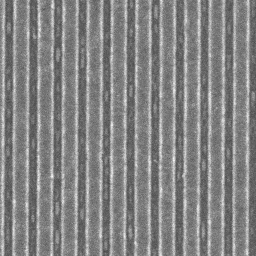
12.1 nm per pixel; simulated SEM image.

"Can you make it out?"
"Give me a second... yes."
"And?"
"parallel lines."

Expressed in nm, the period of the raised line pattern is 295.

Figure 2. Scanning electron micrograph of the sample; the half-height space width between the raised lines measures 116 nm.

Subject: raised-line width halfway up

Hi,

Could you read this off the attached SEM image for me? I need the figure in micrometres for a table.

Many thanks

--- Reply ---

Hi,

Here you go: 0.18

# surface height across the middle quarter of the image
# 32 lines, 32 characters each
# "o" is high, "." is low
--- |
ooo...ooo...oooo..oooo..oooo..oo
ooo...ooo...oooo..oooo..oooo..oo
ooo...ooo...oooo..oooo..oooo..oo
ooo...ooo...ooo...oooo..oooo..oo
ooo...ooo...ooo...oooo..oooo..oo
ooo...ooo...ooo...oooo..oooo..oo
ooo...ooo...ooo...oooo..oooo..oo
ooo...ooo...ooo...oooo..oooo..oo
ooo...ooo...ooo...oooo..oooo..oo
ooo...ooo...ooo...oooo..oooo..oo
ooo...ooo...ooo...oooo..oooo..oo
ooo...ooo...ooo...oooo..oooo..oo
ooo...ooo...ooo...oooo..oooo..oo
ooo...ooo...ooo...oooo..oooo..oo
ooo...ooo...ooo...oooo..oooo..oo
ooo...ooo...ooo...oooo..oooo..oo
ooo...oooo..ooo...oooo..oooo..oo
ooo...ooo...ooo...oooo..oooo..oo
ooo...ooo...ooo...oooo..oooo..oo
ooo...ooo...ooo...oooo..oooo..oo
ooo...ooo...ooo...oooo..oooo..oo
ooo...ooo...ooo...oooo..oooo..oo
ooo...ooo...ooo...oooo..oooo..oo
ooo...ooo...ooo...oooo..oooo..oo
ooo...ooo...ooo...oooo..oooo..oo
ooo...ooo...ooo...ooo...oooo..oo
ooo...ooo...ooo...ooo...oooo..oo
ooo...ooo...ooo...ooo...oooo..oo
ooo...ooo...ooo...ooo...oooo..oo
ooo...ooo...ooo...ooo...oooo..oo
ooo...ooo...ooo...ooo...oooo..oo
ooo...ooo...ooo...ooo...oooo..oo